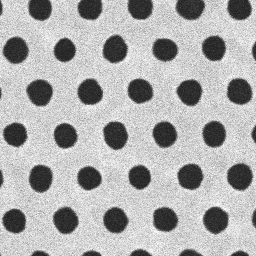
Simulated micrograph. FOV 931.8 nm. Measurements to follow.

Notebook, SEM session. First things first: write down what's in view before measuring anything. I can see a regular array of holes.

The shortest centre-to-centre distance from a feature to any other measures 0.178 microns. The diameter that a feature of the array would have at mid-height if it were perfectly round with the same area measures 0.0882 microns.